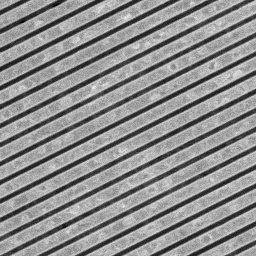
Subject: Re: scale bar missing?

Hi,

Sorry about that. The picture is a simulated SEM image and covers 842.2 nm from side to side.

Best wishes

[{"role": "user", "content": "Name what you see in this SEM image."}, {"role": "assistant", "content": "parallel lines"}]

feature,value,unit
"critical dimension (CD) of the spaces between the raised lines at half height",16.5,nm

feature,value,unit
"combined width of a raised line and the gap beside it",16.8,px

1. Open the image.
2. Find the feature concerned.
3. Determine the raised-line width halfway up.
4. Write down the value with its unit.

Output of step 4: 11.9 pixels